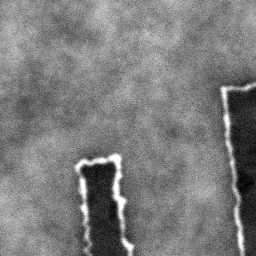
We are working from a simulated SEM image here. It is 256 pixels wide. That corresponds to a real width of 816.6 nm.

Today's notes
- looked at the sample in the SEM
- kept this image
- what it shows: one or a few lines or trenches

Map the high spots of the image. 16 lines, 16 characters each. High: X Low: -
----------------
----------------
----------------
----------------
----------------
--------------XX
--------------XX
--------------XX
--------------XX
--------------XX
-----XX--------X
-----XX--------X
-----XX--------X
-----XXX-------X
-----XXX-------X
-----XXX-------X